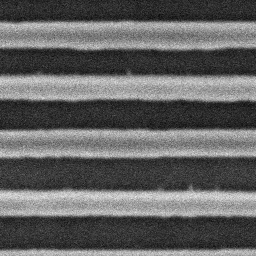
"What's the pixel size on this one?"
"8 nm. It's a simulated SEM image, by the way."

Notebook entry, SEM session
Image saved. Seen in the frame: lines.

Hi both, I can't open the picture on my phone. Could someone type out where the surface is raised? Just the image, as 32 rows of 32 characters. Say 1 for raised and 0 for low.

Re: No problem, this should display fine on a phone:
00000000000000000000000000000000
00000000000000000000000000000000
00000000000000000000000000000000
11111111111111111111111111111111
11111111111111111111111111111111
11111111111111111111111111111111
00000000000000000000000000000000
00000000000000000000000000000000
00000000000000000000000000000000
00000000000000000000000000000000
11111111111111111111111111111111
11111111111111111111111111111111
00000000110000000000000001111101
00000000000000000000000000000000
00000000000000000000000000000000
00000000000000000000000000000000
11111111111111111111111111111111
11111111111111111111111111111111
11111111111111111111111111111111
11101101011111111111000000000000
00000000000000000000000000000000
00000000000000000000000000000000
00000000000000000000000000000000
00000000000000000000000000000000
11111111111111111111111111111111
11111111111111111111111111111111
11111111111111111111111111111111
00000000000000000000000000000000
00000000000000000000000000000000
00000000000000000000000000000000
00000000000000000000000000000000
11111111111111111111111111111111